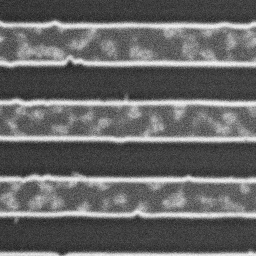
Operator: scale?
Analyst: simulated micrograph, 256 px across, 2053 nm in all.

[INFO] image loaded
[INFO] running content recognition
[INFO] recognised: one or a few lines or trenches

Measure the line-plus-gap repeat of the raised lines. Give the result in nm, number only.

612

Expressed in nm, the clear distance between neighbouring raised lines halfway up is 322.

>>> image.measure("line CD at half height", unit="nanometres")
290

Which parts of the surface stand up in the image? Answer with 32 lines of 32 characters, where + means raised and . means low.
................................
................................
................................
++++++++++++++++++++++++++++++++
++++++++++++++++++++++++++++++++
++++++++++++++++++++++++++++++++
++++++++++++++++++++++++++++++++
++++++++.+++++++++++++++++++++++
................................
................................
................................
................................
................................
++++++++++++++++++++++++++++++++
++++++++++++++++++++++++++++++++
++++++++++++++++++++++++++++++++
++++++++++++++++++++++++++++++++
................................
................................
................................
................................
................................
...+++++++++......+++++++.......
++++++++++++++++++++++++++++++++
++++++++++++++++++++++++++++++++
++++++++++++++++++++++++++++++++
++++++++++++++++++++++++++++++++
................................
................................
................................
................................
................................